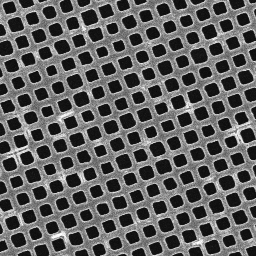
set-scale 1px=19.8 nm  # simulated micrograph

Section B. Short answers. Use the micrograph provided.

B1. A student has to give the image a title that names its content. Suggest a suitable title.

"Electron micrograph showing a regular array of holes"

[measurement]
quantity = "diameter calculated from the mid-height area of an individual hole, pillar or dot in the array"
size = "263 nm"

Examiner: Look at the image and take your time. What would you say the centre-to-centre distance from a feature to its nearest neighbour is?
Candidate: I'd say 353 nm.